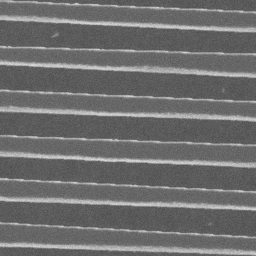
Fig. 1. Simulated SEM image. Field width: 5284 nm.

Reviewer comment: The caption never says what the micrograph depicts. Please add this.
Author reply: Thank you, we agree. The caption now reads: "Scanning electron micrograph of lines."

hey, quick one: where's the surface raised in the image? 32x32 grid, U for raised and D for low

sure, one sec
UUUUUUUUUUDDDDDDDDDDDDDDDDDDDDDD
UUUUUUUUUUUUUUUUUUUUUUUUUUUUUUUD
DDDDDUUUUUUUUUUUUUUUUUUUUUUUUUUU
DDDDDDDDDDDDDDDDDDDDDDDDDUUUUUUU
DDDDDDDDDDDDDDDDDDDDDDDDDDDDDDDD
DDDDDDDDDDDDDDDDDDDDDDDDDDDDDDDD
UUUUUUUUUUUUUUUUUUUUUDDDDDDDDDDD
UUUUUUUUUUUUUUUUUUUUUUUUUUUUUUUU
DDDDDDDDDDDDDUUUUUUUUUUUUUUUUUUU
DDDDDDDDDDDDDDDDDDDDDDDDDDDDDDDD
DDDDDDDDDDDDDDDDDDDDDDDDDDDDDDDD
UUUUDDDDDDDDDDDDDDDDDDDDDDDDDDDD
UUUUUUUUUUUUUUUUUUUUUUUUUUUDDDDD
UUUUUUUUUUUUUUUUUUUUUUUUUUUUUUUU
DDDDDDDDDDDDDDDDDDDDDDDUUUUUUUUU
DDDDDDDDDDDDDDDDDDDDDDDDDDDDDDDD
DDDDDDDDDDDDDDDDDDDDDDDDDDDDDDDD
UUUUUUUUUUUUUUUDDDDDDDDDDDDDDDDD
UUUUUUUUUUUUUUUUUUUUUUUUUUUUUUUU
DDDDUUUUUUUUUUUUUUUUUUUUUUUUUUUU
DDDDDDDDDDDDDDDDDDDDDDDDDDDDDUUU
DDDDDDDDDDDDDDDDDDDDDDDDDDDDDDDD
UUUDDDDDDDDDDDDDDDDDDDDDDDDDDDDD
UUUUUUUUUUUUUUUUUUUUUDDDDDDDDDDD
UUUUUUUUUUUUUUUUUUUUUUUUUUUUUUUU
DDDDDDDDDDDDDDDDDDUUUUUUUUUUUUUU
DDDDDDDDDDDDDDDDDDDDDDDDDDDDDDDD
DDDDDDDDDDDDDDDDDDDDDDDDDDDDDDDD
UUUUUUUUUUUDDDDDDDDDDDDDDDDDDDDD
UUUUUUUUUUUUUUUUUUUUUUUUUUUUUDDD
UUUUUUUUUUUUUUUUUUUUUUUUUUUUUUUU
DDDDDDDDDDDDDDDDDDDDDDDDDDDDUUUU